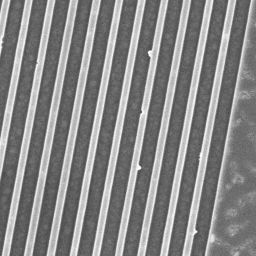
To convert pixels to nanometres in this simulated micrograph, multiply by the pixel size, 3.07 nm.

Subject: parallel lines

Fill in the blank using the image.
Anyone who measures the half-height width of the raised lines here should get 21.1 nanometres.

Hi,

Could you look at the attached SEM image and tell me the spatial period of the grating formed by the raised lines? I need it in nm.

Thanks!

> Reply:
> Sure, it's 68.4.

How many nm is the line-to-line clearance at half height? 48.1